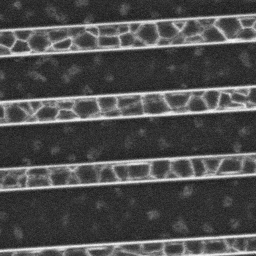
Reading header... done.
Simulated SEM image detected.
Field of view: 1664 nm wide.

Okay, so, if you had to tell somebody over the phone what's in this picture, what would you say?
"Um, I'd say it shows one or a few lines or trenches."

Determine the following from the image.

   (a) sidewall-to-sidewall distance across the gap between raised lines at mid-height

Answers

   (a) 0.295 um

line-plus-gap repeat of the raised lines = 448 nm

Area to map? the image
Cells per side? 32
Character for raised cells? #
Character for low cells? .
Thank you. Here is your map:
................................
................................
.....................###########
......##########################
################################
########################........
########........................
................................
................................
................................
................................
......................##########
......##########################
################################
#################...............
#...............................
................................
................................
................................
............................####
............####################
################################
#####################...........
#####...........................
................................
................................
................................
................................
................................
..............................##
..............##################
################################